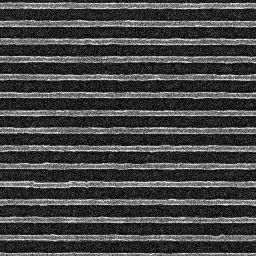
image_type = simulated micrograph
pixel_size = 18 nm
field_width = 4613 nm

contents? parallel lines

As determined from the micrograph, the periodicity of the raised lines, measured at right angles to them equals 321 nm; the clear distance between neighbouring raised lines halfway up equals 11.9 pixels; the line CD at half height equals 106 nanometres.